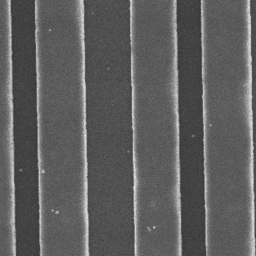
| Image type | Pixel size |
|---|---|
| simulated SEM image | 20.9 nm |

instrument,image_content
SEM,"lines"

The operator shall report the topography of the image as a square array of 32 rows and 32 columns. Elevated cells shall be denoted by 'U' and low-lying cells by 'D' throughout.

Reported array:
UDDDUUUUUUDDDDDDUUUUUUDDDUUUUUUD
UDDDUUUUUUDDDDDDUUUUUUDDDUUUUUUD
UDDDUUUUUUDDDDDDUUUUUUDDDUUUUUUD
UDDDUUUUUUDDDDDDUUUUUUDDDUUUUUUD
UDDDUUUUUUDDDDDDUUUUUUDDDUUUUUUD
UDDDUUUUUUUDDDDDUUUUUUDDDUUUUUUD
UDDDDUUUUUUDDDDDUUUUUUDDDUUUUUUD
UDDDDUUUUUUDDDDDUUUUUUDDDUUUUUUD
UDDDDUUUUUUDDDDDUUUUUUDDDUUUUUUD
UDDDDUUUUUUDDDDDUUUUUUDDDUUUUUUD
UDDDDUUUUUUDDDDDUUUUUUDDDUUUUUUD
UDDDDUUUUUUDDDDDDUUUUUDDDUUUUUUD
UUDDDUUUUUUDDDDDDUUUUUDDDUUUUUUD
UUDDDUUUUUUDDDDDDUUUUUDDDUUUUUUD
UUDDDUUUUUUDDDDDDUUUUUDDDUUUUUUU
UUDDDUUUUUUDDDDDDUUUUUDDDUUUUUUU
UUDDDUUUUUUDDDDDDUUUUUDDDDUUUUUU
UUDDDUUUUUUDDDDDDUUUUUDDDDUUUUUU
UUDDDUUUUUUDDDDDDUUUUUDDDDUUUUUU
UUDDDUUUUUUDDDDDDUUUUUDDDDUUUUUU
UUDDDUUUUUUDDDDDDUUUUUDDDDUUUUUU
UUDDDUUUUUUDDDDDDUUUUUDDDDUUUUUU
UUDDDUUUUUUDDDDDDUUUUUDDDDUUUUUU
UUDDDUUUUUUDDDDDDUUUUUDDDDUUUUUU
UUDDDUUUUUUDDDDDDUUUUUUDDDUUUUUU
UUDDDUUUUUUDDDDDDUUUUUUDDDUUUUUU
UUDDDUUUUUUDDDDDDUUUUUUDDDUUUUUU
UUDDDUUUUUUDDDDDDUUUUUUDDDUUUUUU
UUDDDUUUUUUDDDDDDUUUUUUDDDUUUUUU
UUDDDUUUUUUDDDDDDUUUUUUDDDUUUUUU
UUDDDUUUUUUDDDDDDUUUUUUDDDUUUUUU
UUDDDUUUUUUDDDDDDUUUUUUDDDUUUUUU